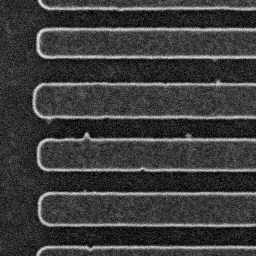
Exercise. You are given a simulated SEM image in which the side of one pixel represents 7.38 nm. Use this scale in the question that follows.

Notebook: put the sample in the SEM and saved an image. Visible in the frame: parallel lines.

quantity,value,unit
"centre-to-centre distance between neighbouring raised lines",408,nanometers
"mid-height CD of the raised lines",32.5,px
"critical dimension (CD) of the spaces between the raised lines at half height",21.6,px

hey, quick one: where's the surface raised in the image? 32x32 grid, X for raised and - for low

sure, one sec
-----XXXXXXXXXXXXXXXXXXXXXXXXXXX
--------------------------------
--------------------------------
--------------------------------
-----XXXXXXXXXXXXXXXXXXXXXXXXXXX
-----XXXXXXXXXXXXXXXXXXXXXXXXXXX
-----XXXXXXXXXXXXXXXXXXXXXXXXXXX
--------------------------------
--------------------------------
--------------------------------
-----XXXXXXXXXXXXXXXXXXXXXXXXXXX
----XXXXXXXXXXXXXXXXXXXXXXXXXXXX
----XXXXXXXXXXXXXXXXXXXXXXXXXXXX
----XXXXXXXXXXXXXXXXXXXXXXXXXXXX
-----XXXXXXXXXXXXXXXXXXXXXXXXXXX
--------------------------------
--------------------------------
------XXXXXXXXXXXXXXXXXXXXXXXXX-
-----XXXXXXXXXXXXXXXXXXXXXXXXXXX
-----XXXXXXXXXXXXXXXXXXXXXXXXXXX
-----XXXXXXXXXXXXXXXXXXXXXXXXXXX
--------------------------------
--------------------------------
--------------------------------
-----XXXXXXXXXXXXXXXXXXXXXXXXXXX
-----XXXXXXXXXXXXXXXXXXXXXXXXXXX
-----XXXXXXXXXXXXXXXXXXXXXXXXXXX
-----XXXXXXXXXXXXXXXXXXXXXXXXXXX
--------------------------------
--------------------------------
--------------------------------
-----XXXXXXXXXXXXXXXXXXXXXXXXXXX